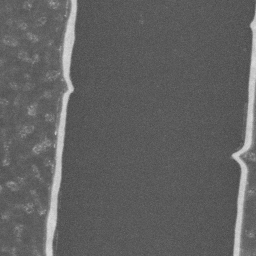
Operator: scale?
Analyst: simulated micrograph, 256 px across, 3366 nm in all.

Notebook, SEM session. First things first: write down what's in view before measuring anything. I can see one or a few lines or trenches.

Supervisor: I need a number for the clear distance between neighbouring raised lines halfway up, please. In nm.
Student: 2440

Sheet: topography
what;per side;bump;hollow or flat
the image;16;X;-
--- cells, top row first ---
XXXXX-----------
XXXX------------
XXXX------------
XXXX------------
XXXX------------
XXXX------------
XXXX------------
XXXX------------
XXXX------------
XXXX-----------X
XXXX-----------X
XXXX-----------X
XXX------------X
XXX------------X
XXX------------X
XXX------------X